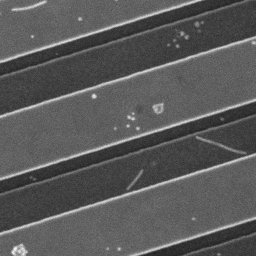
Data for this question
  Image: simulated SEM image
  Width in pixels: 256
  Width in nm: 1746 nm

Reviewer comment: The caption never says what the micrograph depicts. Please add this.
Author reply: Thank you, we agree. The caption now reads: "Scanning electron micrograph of lines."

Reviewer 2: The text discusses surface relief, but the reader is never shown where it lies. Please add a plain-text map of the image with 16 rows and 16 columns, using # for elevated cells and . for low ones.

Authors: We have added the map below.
###########.....
########........
#####..........#
#...........####
.........#######
......##########
..#############.
############....
#########.......
######..........
##...........###
..........######
.......#########
...#############
#############...
##########......